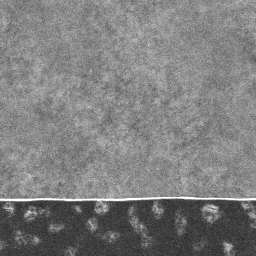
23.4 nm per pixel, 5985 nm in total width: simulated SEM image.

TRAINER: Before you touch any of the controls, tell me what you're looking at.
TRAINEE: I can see one or a few lines or trenches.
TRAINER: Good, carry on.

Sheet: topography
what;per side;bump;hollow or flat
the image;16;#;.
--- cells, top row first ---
................
................
................
................
................
................
................
................
................
................
................
................
.###.###########
################
################
################